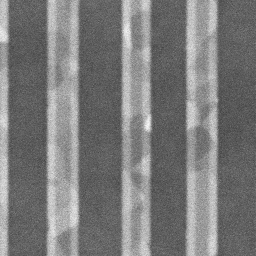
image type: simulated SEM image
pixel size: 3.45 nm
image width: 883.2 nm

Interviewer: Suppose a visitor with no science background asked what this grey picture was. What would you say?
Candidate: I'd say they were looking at one or a few lines or trenches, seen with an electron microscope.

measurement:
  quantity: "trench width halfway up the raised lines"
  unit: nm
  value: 165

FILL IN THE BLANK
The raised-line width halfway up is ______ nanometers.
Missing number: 75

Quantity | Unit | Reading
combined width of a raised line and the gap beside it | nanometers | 240